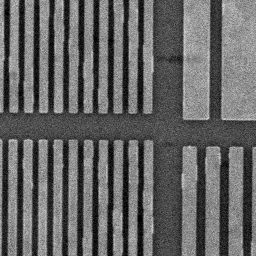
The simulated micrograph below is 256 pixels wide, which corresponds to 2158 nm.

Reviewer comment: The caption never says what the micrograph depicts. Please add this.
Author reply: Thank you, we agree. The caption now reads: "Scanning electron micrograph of groups of lines, slits or small figures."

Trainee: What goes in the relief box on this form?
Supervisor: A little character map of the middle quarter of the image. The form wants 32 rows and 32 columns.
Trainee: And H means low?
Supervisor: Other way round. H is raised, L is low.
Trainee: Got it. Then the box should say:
LHHLLHHLLHHLLHLLHHLLHHLLLLLLLLHH
LHHLLHHLLHHLLHLLHHLLHHLLLLLLLLHH
LHHLLHHLLHHLLHLLHHLLHHLLLLLLLLHH
LHHLLHHLLHHLLHLLHHLLHHLLLLLLLLHH
LHHLLHHLLHHLHHLLHHLLHHLLLLLLLLHH
LHHLLHHLLHHLHHLLHHLLHHLLLLLLLLHH
LHHLLHHLLHHLHHLLHHLLHHLLLLLLLLHH
LHHLLHHLLHHLHHLLHHLLHHLLLLLLLLHH
LHHLLHHLLHHLHHLLHHLLHHLLLLLLLLHH
LHHLLHHLLHHLHHLLHHLLHHLLLLLLLLHH
LHHLLHHLLHHLHHLLHHLLHHLLLLLLLLHH
LHHLLHHLLHHLHHLLHHLLHHLLLLLLLLHH
LLLLLLLLLLLLLLLLLLLLLLLLLLLLLLHH
LLLLLLLLLLLLLLLLLLLLLLLLLLLLLLHH
LLLLLLLLLLLLLLLLLLLLLLLLLLLLLLLL
LLLLLLLLLLLLLLLLLLLLLLLLLLLLLLLL
LLLLLLLLLLLLLLLLLLLLLLLLLLLLLLLL
LLLLLLLLLLLLLLLLLLLLLLLLLLLLLLLL
LLLLLLLLLLLLLLLLLLLLLLLLLLLLLLLL
LHHLLHHLLHHLLHHLHHLLHHLLLLLLLLLL
LHHLLHHLLHHLLHHLHHLLHHLLLLLLLLLL
LHHLLHHLLHHLLHHLHHLLHHLLLLLLLLHH
LHHLLHHLLHHLLHHLHHLLHHLLLLLLLLHH
LHHLLHHLLHHLLHHLHHLLHHLLLLLLLLHH
LHHLLHHLLHHLLHHLHHLLHHLLLLLLLLHH
LHHLLHHLLHHLLHHLHHLLHHLLLLLLLLHH
LHHLLHHLLHHLLHLLHHLLHHLLLLLLLLHH
LHHLLHHLLHHLLHLLHHLLHHLLLLLLLLHH
LHHLLHHLLHHLLHLLHHLLHHLLLLLLLLHH
LHHLLHHLLHHLHHLLHHLLHHLLLLLLLLHH
LHHLLHHLLHHLHHLLHHLLHHLLLLLLLLHH
LHHLLHHLLHHLHHLLHHLLHHLLLLLLLLHH